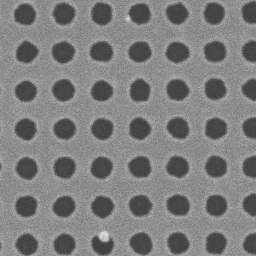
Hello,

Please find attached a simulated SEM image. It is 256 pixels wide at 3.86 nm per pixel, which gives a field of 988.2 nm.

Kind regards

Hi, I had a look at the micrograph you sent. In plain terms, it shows a regular array of holes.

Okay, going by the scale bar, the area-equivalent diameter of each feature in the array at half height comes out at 87.2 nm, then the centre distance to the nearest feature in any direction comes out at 37.6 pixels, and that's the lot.